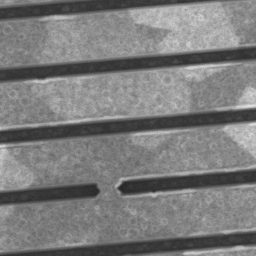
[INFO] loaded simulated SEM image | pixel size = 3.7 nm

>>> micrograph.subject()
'one or a few lines or trenches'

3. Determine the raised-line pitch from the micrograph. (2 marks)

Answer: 227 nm